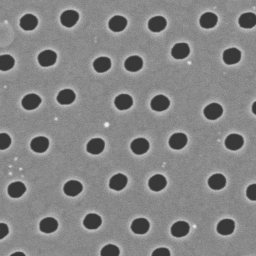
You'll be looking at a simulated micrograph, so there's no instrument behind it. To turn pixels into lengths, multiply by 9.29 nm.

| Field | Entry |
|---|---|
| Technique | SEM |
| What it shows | a regular array of holes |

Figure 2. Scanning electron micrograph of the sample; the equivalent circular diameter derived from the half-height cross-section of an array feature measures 166 nanometres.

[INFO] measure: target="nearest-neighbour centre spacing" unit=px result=38.9